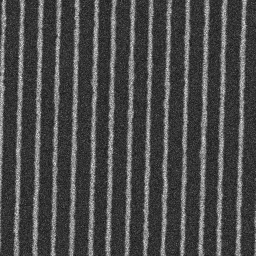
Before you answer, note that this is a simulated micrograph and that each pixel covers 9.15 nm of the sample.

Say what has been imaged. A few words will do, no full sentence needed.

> parallel lines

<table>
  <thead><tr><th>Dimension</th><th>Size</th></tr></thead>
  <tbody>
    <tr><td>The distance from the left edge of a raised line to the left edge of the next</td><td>169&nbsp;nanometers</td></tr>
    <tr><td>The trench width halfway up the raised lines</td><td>138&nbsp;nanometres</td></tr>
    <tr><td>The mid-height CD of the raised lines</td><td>33.2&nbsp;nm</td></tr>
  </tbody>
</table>